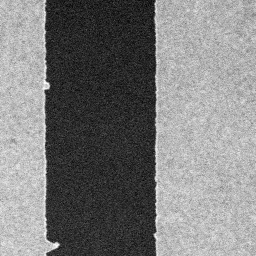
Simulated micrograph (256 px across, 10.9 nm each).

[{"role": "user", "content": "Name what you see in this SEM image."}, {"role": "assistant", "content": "one or a few lines or trenches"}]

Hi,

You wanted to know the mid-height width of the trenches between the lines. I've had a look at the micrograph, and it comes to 1210 nanometers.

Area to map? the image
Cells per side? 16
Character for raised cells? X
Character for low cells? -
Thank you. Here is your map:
XXX-------XXXXXX
XXX-------XXXXXX
XXX-------XXXXXX
XXX-------XXXXXX
XXX-------XXXXXX
XXX-------XXXXXX
XXX-------XXXXXX
XXX-------XXXXXX
XXX-------XXXXXX
XXX-------XXXXXX
XXX-------XXXXXX
XXX-------XXXXXX
XXX-------XXXXXX
XXX-------XXXXXX
XXX-------XXXXXX
XXX-------XXXXXX